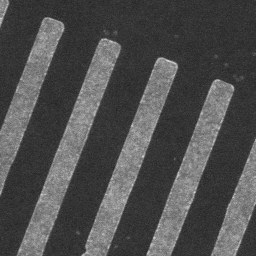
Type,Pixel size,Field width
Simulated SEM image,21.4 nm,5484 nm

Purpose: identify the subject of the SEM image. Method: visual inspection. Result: parallel lines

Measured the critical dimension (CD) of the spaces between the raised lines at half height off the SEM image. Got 808 nm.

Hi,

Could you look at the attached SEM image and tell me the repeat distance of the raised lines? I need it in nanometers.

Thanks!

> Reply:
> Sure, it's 1280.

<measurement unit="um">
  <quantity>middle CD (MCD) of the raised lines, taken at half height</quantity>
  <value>0.487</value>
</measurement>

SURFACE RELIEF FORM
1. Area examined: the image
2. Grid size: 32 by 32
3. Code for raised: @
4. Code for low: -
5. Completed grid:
@-------------------------------
@-------------------------------
------@-------------------------
-----@@@------------------------
-----@@@------------------------
----@@@-----@@@-----------------
----@@@-----@@@-----------------
---@@@------@@@-----@-----------
---@@@-----@@@-----@@@----------
---@@@-----@@@-----@@@----------
--@@@-----@@@-----@@@------@@---
--@@@-----@@@-----@@@-----@@@---
--@@@-----@@@-----@@@-----@@@---
-@@@-----@@@-----@@@-----@@@----
-@@@-----@@@-----@@@-----@@@----
@@@------@@------@@------@@@----
@@@-----@@@-----@@@-----@@@-----
@@@-----@@@-----@@@-----@@@-----
@@-----@@@-----@@@-----@@@------
@@-----@@@-----@@@-----@@@-----@
@------@@@-----@@@-----@@@-----@
@-----@@@-----@@@-----@@@-----@@
@-----@@@-----@@@-----@@@-----@@
-----@@@-----@@@------@@@-----@@
-----@@@-----@@@-----@@@-----@@@
-----@@@-----@@@-----@@@-----@@@
----@@@-----@@@-----@@@-----@@@@
----@@@-----@@@-----@@@-----@@@-
---@@@------@@@-----@@@-----@@@-
---@@@-----@@@-----@@@------@@--
---@@@-----@@@-----@@@-----@@@--
--@@@------@@-----@@@@-----@@@--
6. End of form